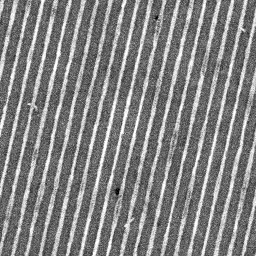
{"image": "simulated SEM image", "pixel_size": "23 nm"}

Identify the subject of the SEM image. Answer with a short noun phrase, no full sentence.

parallel lines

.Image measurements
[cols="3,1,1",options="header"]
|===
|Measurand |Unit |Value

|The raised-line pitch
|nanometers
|303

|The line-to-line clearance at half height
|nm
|241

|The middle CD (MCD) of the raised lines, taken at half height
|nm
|64.4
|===